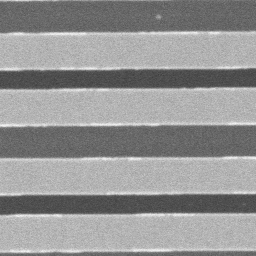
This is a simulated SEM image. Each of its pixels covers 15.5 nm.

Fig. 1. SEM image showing lines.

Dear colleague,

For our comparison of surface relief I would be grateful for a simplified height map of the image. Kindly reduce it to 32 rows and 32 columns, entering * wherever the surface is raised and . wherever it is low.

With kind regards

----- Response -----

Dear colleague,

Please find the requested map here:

................................
................................
................................
................................
********************************
********************************
********************************
********************************
*******************************.
................................
................................
********************************
********************************
********************************
********************************
********************************
................................
................................
................................
................................
********************************
********************************
********************************
********************************
................................
................................
................................
********************************
********************************
********************************
********************************
................................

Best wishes